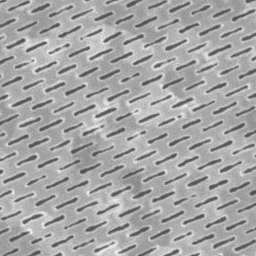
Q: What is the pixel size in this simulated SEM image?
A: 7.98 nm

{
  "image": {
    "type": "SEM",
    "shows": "a regular array of holes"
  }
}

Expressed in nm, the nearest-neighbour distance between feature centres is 163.